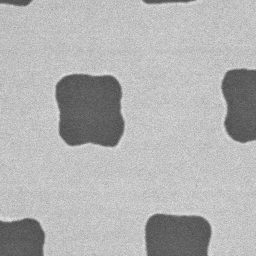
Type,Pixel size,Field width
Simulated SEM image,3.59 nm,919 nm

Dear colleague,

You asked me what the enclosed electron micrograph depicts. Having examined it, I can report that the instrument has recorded holes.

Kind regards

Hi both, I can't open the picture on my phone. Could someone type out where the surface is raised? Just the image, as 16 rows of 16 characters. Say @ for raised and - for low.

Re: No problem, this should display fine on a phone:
@@@@@@@@@@@@@@@@
@@@@@@@@@@@@@@@@
@@@@@@@@@@@@@@@@
@@@@@@@@@@@@@@@@
@@@@@@@@@@@@@@--
@@@-----@@@@@@--
@@@@----@@@@@@--
@@@@----@@@@@@--
@@@@----@@@@@@--
@@@@@@@@@@@@@@@@
@@@@@@@@@@@@@@@@
@@@@@@@@@@@@@@@@
@@@@@@@@@@@@@@@@
@@@@@@@@@@--@@@@
---@@@@@@----@@@
---@@@@@@----@@@